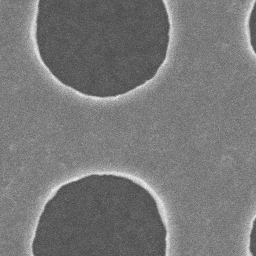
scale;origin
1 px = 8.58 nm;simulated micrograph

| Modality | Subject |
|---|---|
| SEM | holes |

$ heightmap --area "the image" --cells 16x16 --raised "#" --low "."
##........######
##.........####.
##.........#####
###.......######
###.......######
####....########
################
################
################
################
################
####.....#######
###.......######
###.......######
##........######
##........######